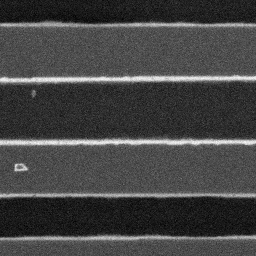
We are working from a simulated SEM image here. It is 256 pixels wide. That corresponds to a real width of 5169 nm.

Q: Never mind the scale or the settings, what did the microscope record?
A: lines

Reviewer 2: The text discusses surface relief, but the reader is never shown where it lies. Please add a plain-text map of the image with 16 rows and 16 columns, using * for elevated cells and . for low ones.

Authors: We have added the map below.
................
................
****************
****************
****************
................
................
................
................
****************
****************
****************
................
................
................
****************